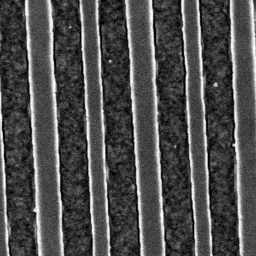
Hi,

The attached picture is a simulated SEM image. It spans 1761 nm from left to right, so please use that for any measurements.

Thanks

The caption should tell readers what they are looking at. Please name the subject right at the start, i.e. lines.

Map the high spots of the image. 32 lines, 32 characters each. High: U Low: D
DDDUUUDDDDUUDDDDUUUDDDDUUDDDDUUU
DDDUUUDDDDUUDDDDUUUDDDDUUDDDDUUU
DDDUUUDDDDUUDDDDUUUDDDDUUDDDDUUU
DDDUUUDDDDUUDDDDUUUDDDDUUDDDDUUU
DDDUUUUDDDUUDDDDUUUDDDDUUDDDDUUU
DDDUUUUDDDUUDDDDUUUDDDDUUDDDDUUU
DDDDUUUDDDUUUDDDUUUDDDDUUDDDDUUU
DDDDUUUDDDUUUDDDUUUDDDDUUDDDDUUU
DDDDUUUDDDUUUDDDUUUDDDDUUDDDDUUU
DDDDUUUDDDUUUDDDUUUDDDDUUDDDDUUU
DDDDUUUDDDDUUDDDUUUDDDDUUDDDDUUU
DDDDUUUDDDDUUDDDUUUDDDDUUDDDDUUU
DDDDUUUDDDDUUDDDUUUUDDDUUDDDDUUU
DDDDUUUDDDDUUDDDDUUUDDDUUUDDDUUU
DDDDUUUDDDDUUDDDDUUUDDDDUUDDDUUU
DDDDUUUDDDDUUDDDDUUUDDDDUUDDDUUU
DDDDUUUDDDDUUDDDDUUUDDDDUUDDDUUU
DDDDUUUDDDDUUDDDDUUUDDDDUUDDDUUU
DDDDUUUDDDDUUDDDDUUUDDDDUUDDDUUU
DDDDUUUDDDDUUDDDDUUUDDDDUUDDDDUU
DDDDUUUDDDDUUDDDDUUUDDDDUUDDDDUU
DDDDUUUDDDDUUDDDDUUUDDDDUUDDDDUU
UDDDUUUDDDDUUDDDDUUUDDDDUUDDDDUU
UDDDDUUDDDDUUDDDDUUUDDDDUUDDDDUU
UDDDDUUUDDDUUDDDDUUUDDDDUUDDDDUU
UDDDDUUUDDDUUDDDDUUUDDDDUUDDDDUU
UDDDDUUUDDDUUDDDDUUUDDDDUUDDDDUU
UDDDDUUUDDDUUUDDDUUUDDDDUUDDDDUU
UDDDDUUUDDDDUUDDDUUUDDDDUUDDDDUU
UDDDDUUUDDDDUUDDDDUUDDDDUUDDDDUU
UDDDDUUUDDDDUUDDDDUUUDDDUUDDDDUU
UDDDDUUUDDDDUUDDDDUUUDDDUUDDDDUU